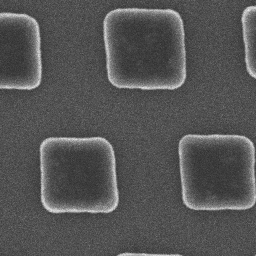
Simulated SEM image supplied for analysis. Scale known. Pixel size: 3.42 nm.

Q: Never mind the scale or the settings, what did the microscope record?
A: raised bodies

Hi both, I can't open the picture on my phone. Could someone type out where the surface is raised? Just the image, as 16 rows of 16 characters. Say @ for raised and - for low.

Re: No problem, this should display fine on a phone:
----------------
@@-----@@@@----@
@@-----@@@@----@
@@-----@@@@@---@
@@@----@@@@@----
-@------@@@-----
----------------
----------------
------------@@@-
---@@@@----@@@@@
---@@@@----@@@@@
---@@@@----@@@@@
---@@@@-----@@@@
----------------
----------------
----------------